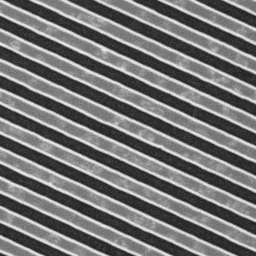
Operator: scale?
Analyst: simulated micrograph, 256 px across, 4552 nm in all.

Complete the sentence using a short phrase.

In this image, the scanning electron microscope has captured parallel lines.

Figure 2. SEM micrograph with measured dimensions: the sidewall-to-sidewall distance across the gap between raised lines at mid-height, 230 nanometres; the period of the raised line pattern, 477 nm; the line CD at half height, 246 nm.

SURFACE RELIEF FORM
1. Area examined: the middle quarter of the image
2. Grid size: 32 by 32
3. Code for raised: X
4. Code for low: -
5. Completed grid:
XXXX--------XXXXXXXX--------XXXX
XXXXXX--------XXXXXXXX--------XX
XXXXXXXX--------XXXXXXXX--------
--XXXXXXXX--------XXXXXXXX------
-----XXXXXXXX-------XXXXXXXXX---
-------XXXXXXXX-------XXXXXXXXX-
X--------XXXXXXXX-------XXXXXXXX
XXX--------XXXXXXXX--------XXXXX
XXXXX--------XXXXXXXX--------XXX
XXXXXXX--------XXXXXXXXX-------X
--XXXXXXXX--------XXXXXXXX------
----XXXXXXXX--------XXXXXXXX----
-----XXXXXXXX---------XXXXXXXX--
--------XXXXXXXX--------XXXXXXXX
XX--------XXXXXXXX--------XXXXXX
XXXX--------XXXXXXXX--------XXXX
XXXXXXX-------XXXXXXXXX--------X
XXXXXXXXX-------XXXXXXXXX-------
--XXXXXXXXX-------XXXXXXXXX-----
-----XXXXXXXX--------XXXXXXXX---
-------XXXXXXXX--------XXXXXXXX-
X--------XXXXXXXX--------XXXXXXX
XXXX--------XXXXXXXX--------XXXX
XXXXXX-------XXXXXXXXX--------XX
XXXXXXXX--------XXXXXXXX--------
--XXXXXXXX--------XXXXXXXX------
----XXXXXXXX--------XXXXXXXX----
------XXXXXXXX--------XXXXXXXX--
--------XXXXXXXXX--------XXXXXXX
XXX--------XXXXXXX---------XXXXX
XXXXX-------XXXXXXXXX--------XXX
XXXXXXX--------XXXXXXXX--------X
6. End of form